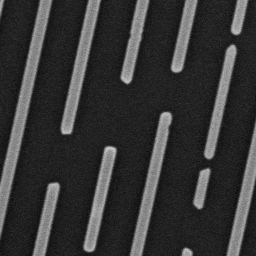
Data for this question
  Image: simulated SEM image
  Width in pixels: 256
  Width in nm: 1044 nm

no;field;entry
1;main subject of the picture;parallel lines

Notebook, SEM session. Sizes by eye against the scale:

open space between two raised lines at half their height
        152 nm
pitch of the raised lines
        195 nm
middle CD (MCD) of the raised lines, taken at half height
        0.0414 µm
